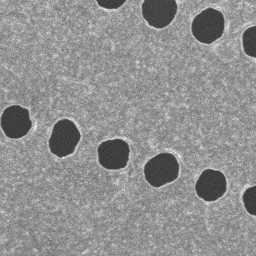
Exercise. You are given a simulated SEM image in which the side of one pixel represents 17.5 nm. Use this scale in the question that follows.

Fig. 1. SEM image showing holes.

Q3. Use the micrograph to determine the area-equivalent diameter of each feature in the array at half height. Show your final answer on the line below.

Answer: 590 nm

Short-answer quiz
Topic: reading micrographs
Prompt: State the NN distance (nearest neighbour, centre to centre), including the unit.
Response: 908 nm